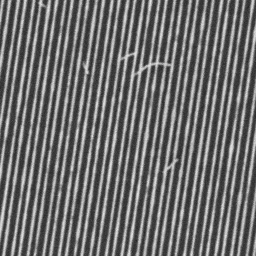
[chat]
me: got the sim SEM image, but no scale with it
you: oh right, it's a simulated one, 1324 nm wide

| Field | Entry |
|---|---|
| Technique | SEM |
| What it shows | parallel lines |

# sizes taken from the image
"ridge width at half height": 10.2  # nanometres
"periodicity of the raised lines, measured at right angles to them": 40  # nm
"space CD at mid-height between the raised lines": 30.1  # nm